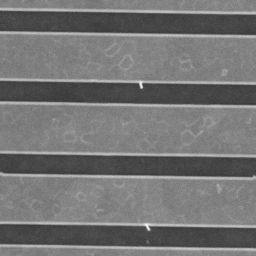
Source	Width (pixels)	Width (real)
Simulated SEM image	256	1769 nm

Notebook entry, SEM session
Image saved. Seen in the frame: one or a few lines or trenches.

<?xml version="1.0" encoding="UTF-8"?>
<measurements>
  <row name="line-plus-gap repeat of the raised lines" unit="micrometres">0.492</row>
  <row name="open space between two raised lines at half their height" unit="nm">160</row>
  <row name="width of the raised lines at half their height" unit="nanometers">332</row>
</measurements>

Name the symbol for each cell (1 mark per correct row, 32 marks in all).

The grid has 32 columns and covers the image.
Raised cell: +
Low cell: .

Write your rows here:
++++++++++++++++++++++++++++++++
......................++++++++++
................................
................................
++++++++++++++++++++++..........
++++++++++++++++++++++++++++++++
++++++++++++++++++++++++++++++++
++++++++++++++++++++++++++++++++
++++++++++++++++++++++++++++++++
++++++++++++++++++++++++++++++++
................................
................................
................................
++++++++++++++++++++++++++++++++
++++++++++++++++++++++++++++++++
++++++++++++++++++++++++++++++++
++++++++++++++++++++++++++++++++
++++++++++++++++++++++++++++++++
++++++++++++++++++++++++++++++++
................................
................................
................................
++++++++++++++++++++++++++++++++
++++++++++++++++++++++++++++++++
++++++++++++++++++++++++++++++++
++++++++++++++++++++++++++++++++
++++++++++++++++++++++++++++++++
++++++++++++++++++++++++++++++++
................................
................................
................................
++++++++++++++++++++++++++++++++